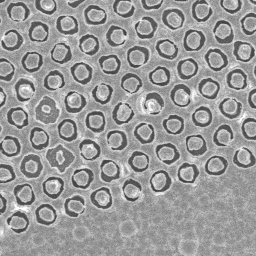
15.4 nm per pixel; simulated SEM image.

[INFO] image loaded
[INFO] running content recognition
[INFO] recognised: a regular array of ring-shaped grooves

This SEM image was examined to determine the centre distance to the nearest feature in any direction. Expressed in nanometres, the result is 432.